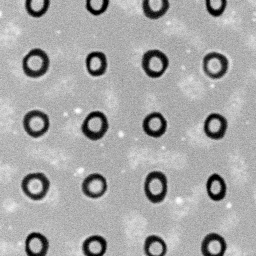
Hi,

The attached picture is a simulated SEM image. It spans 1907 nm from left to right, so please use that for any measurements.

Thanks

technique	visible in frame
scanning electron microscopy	a regular array of ring-shaped grooves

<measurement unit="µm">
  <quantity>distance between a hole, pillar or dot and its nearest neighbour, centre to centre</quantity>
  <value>0.442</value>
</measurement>